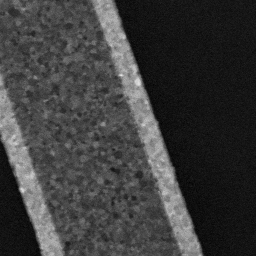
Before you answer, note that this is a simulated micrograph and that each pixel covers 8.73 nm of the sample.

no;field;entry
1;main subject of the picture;one or a few lines or trenches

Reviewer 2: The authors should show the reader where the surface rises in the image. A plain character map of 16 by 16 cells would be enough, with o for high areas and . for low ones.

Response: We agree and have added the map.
ooooooo.........
ooooooo.........
ooooooo.........
oooooooo........
oooooooo........
oooooooo........
ooooooooo.......
ooooooooo.......
.oooooooo.......
.ooooooooo......
.ooooooooo......
..oooooooo......
..ooooooooo.....
...oooooooo.....
...oooooooo.....
...ooooooooo....